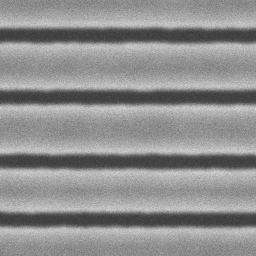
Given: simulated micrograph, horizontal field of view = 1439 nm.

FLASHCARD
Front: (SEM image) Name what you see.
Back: lines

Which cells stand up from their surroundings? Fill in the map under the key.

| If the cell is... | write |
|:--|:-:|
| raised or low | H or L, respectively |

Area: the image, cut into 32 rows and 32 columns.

HHHHHHHHHHHHHHHHHHHHHHHHHHHHHHHH
HHHHHHHHHHHHHHHHHHHHHHHHHHHHHHHH
HHHHHHHHHHHHHHHHHHHHHHHHHHHHHHHH
LLLLLLLLLLLLLLLLLLLLLLLLLLHLLLLL
LLLLLLLLLLLLLLLLLLLLLLLLLLLLLLLL
HHHHLLHHHHHHHLLHHHHHHLLLLHHHHHLH
HHHHHHHHHHHHHHHHHHHHHHHHHHHHHHHH
HHHHHHHHHHHHHHHHHHHHHHHHHHHHHHHH
HHHHHHHHHHHHHHHHHHHHHHHHHHHHHHHH
HHHHHHHHHHHHHHHHHHHHHHHHHHHHHHHH
HHHHHHHHHHHHHHHHHHHHHHHHHHHHHHHH
LLLLLLLLLLLLLLLLLLLLLLLLLLLLLLLL
LLLLLLLLLLLLLLLLLLLLLLLLLLLLLLLL
HHHHHHHHHHHHHHHHHHHHHHHHHHHHHHHH
HHHHHHHHHHHHHHHHHHHHHHHHHHHHHHHH
HHHHHHHHHHHHHHHHHHHHHHHHHHHHHHHH
HHHHHHHHHHHHHHHHHHHHHHHHHHHHHHHH
HHHHHHHHHHHHHHHHHHHHHHHHHHHHHHHH
HHHHHHHHHHHHHHHHHHHHHHHHHHHHHHHH
LLLLLLLLLLLLLLLLLLLLLLLLLLLLLLLL
LLLLLLLLLLLLLLLLLLLLLLLLLLLLLLLL
HHHHHHHHHHHHHHHHHHHHHHHHHHHHHHHH
HHHHHHHHHHHHHHHHHHHHHHHHHHHHHHHH
HHHHHHHHHHHHHHHHHHHHHHHHHHHHHHHH
HHHHHHHHHHHHHHHHHHHHHHHHHHHHHHHH
HHHHHHHHHHHHHHHHHHHHHHHHHHHHHHHH
LLLHHLLLLLLLLLLLLLHLLLLLLLLLLLLL
LLLLLLLLLLLLLLLLLLLLLLLLLLLLLLLL
HLLLLLHHHLLLLLHLLLLLLLLHLLLLLLLL
HHHHHHHHHHHHHHHHHHHHHHHHHHHHHHHH
HHHHHHHHHHHHHHHHHHHHHHHHHHHHHHHH
HHHHHHHHHHHHHHHHHHHHHHHHHHHHHHHH